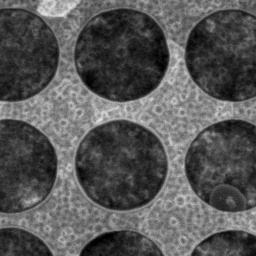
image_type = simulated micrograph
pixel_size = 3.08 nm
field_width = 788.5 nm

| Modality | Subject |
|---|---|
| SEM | holes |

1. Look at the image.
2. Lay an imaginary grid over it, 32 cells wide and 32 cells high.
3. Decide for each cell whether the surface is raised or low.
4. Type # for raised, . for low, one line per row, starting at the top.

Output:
################################
....#########.....#########....#
.....######........######.......
......####..........####........
.......###...........###........
.......##............##.........
........#............##.........
.......##............##.........
.......##............##.........
.......###...........###........
......####..........####........
.....######........#######......
...##########....##########....#
################################
################################
....#########....##########.....
.....######........######.......
......####..........####........
.......###...........###........
.......##............##.........
.......##............##.........
.......##............##.........
.......###...........##.........
.......###..........####........
......#####.........#####.......
.....#######.......#######......
...#########################..##
################################
..##############################
.....#######......########......
......#####.........#####.......
......####..........####........